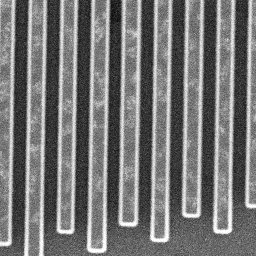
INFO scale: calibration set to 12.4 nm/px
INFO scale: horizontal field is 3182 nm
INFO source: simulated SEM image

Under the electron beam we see parallel lines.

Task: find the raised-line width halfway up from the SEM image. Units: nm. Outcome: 197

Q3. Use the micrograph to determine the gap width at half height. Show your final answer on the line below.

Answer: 188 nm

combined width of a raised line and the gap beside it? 390 nm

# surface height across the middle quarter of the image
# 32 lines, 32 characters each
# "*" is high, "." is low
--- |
***....****....****....***....**
***....****....****....***....**
***....****....****....***....**
***....****....****....***....**
***....****....****....***....**
***....****....****....***....**
***....****....****....***....**
***....****....****....***....**
***....****....****....***....**
***....****....****....***....**
***....****....****....***....**
***....****...*****....***....**
***....****...*****....***....**
***....****....***....****....**
***....****....***....****....**
***....****....***....****....**
***....****...****....****....**
***....****...****....****....**
***....****...****....****....**
**.....****...****....****....**
**.....****...****....****....**
**.....****...****....****....**
**.....****...****....****....**
**.....****...****....****....**
**.....****...****....****....**
**.....****...****....****....**
**.....****...****....****....**
**.....****...****....****....**
***....****...****....****....**
***....***....****....****....**
***....***....****....****....**
***....***....****....****....**